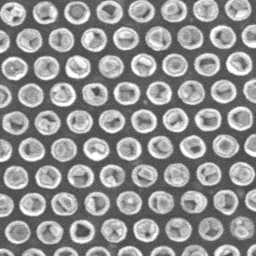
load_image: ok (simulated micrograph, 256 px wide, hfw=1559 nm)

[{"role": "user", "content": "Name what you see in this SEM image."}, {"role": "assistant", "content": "a regular array of raised bodies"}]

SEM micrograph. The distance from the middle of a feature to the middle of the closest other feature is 190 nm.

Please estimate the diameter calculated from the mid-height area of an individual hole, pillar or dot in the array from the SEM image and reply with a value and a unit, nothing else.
133 nanometers